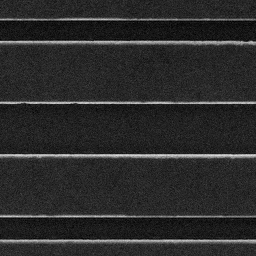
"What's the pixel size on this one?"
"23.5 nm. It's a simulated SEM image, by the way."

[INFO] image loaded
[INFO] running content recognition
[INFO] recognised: lines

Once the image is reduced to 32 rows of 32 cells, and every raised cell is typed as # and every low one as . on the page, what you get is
################################
################################
................................
................................
................................
################################
################################
################################
################################
################################
################################
################################
################################
................................
................................
................................
................................
................................
................................
################################
################################
################################
################################
################################
################################
################################
################################
................................
................................
................................
################################
################################